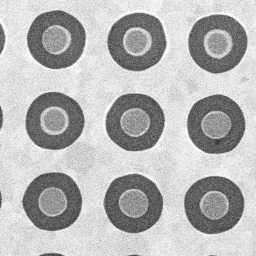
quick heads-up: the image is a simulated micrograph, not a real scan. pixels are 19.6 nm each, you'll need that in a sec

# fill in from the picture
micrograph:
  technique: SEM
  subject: an array of small figures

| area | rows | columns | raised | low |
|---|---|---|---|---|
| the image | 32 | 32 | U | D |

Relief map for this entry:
UUUUUUUUUUUUUUUUUUUUUUUUUUUUUUUU
UUUUUUDDUUUUUUUUUDUUUUUUUUUUUUUU
UUUUDDDDDDUUUUUDDDDDUUUUUDDDDDUU
UUUUDDUUDDUUUUDDDDDDUUUUDDDDDDDU
DUUDDUUUUDDUUDDDUUUDDUUUDDUUDDDU
DUUDDUUUDDDUUDDDUUUDDUUDDDUUUDDU
UUUUDDUUDDDUUUDDUUDDDUUUDDUUDDDU
UUUUDDDDDDUUUUDDDDDDUUUUDDDDDDUU
UUUUUUDDUUUUUUUDDDDUUUUUUDDDDUUU
UUUUUUUUUUUUUUUUUUUUUUUUUUUUUUUU
UUUUUUUUUUUUUUUUUUUUUUUUUUUUUUUU
UUUUUUDUUUUUUUUUUUUUUUUUUUUUUUUU
UUUUDDDDDUUUUUDDDDDUUUUUUDDDDUUU
UUUUDDUDDDUUUUDDDDDDUUUUDDDDDDUU
UUUDDUUUDDDUUDDUUUDDDUUDDDUUDDDU
UUUDDUUUDDDUUDDUUUUDDUUDDUUUUDDU
UUUDDDUDDDUUUDDDUUDDUUUDDDUUDDDU
UUUUDDDDDDUUUUDDDDDDUUUUDDDDDDUU
UUUUUDDDUUUUUUUDDDDUUUUUUDDDDUUU
UUUUUUUUUUUUUUUUUUUUUUUUUUUUUUUU
UUUUUUUUUUUUUUUUUUUUUUUUUUUUUUUU
UUUUUUUUUUUUUUUUUUUUUUUUUUUUUUUU
UUUUDDDDDUUUUUDDDDDUUUUUUDDDDUUU
UUUDDDDDDDUUUDDDDDDDUUUUDDDDDDUU
UUUDDUUUDDUUUDDUUUDDUUUDDDUUDDUU
UUUDDUUUDDUUUDDUUUDDUUUDDUUUDDDU
UUUDDUUUDDUUUDDUUUDDUUUDDUUUDDUU
UUUUDDDDDDUUUUDDDDDDUUUDDDDDDDUU
UUUUUDDDUUUUUUUDDDDUUUUUDDDDDUUU
UUUUUUUUUUUUUUUUUUUUUUUUUUUUUUUU
UUUUUUUUUUUUUUUUUUUUUUUUUUUUUUUU
UUUUUUUUUUUUUUUUUUUUUUUUUUUUUUUU